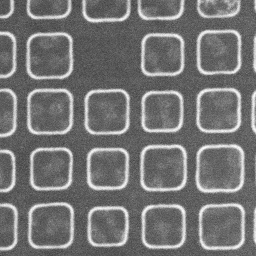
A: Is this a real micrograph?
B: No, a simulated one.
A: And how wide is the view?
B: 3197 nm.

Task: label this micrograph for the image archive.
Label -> a regular array of raised bodies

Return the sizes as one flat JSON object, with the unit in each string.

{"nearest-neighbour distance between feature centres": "0.699 µm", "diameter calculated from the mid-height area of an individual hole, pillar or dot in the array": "0.573 microns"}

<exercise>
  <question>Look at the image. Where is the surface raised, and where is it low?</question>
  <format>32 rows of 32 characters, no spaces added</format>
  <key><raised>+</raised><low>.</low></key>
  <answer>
++..+++++.++++++.++++++..+++++..
+...+++++..+++++.++++++..+++++..
...........++++.................
................................
+...++++...........+++...+++++..
++.++++++.........+++++..+++++..
++..+++++.........+++++..+++++..
++..+++++.........+++++..+++++..
++..+++++.........+++++..+++++..
+...++++........................
................................
+...++++....++++.........+++++..
++..+++++..+++++..+++++..+++++..
++..+++++..+++++..+++++..+++++..
++..+++++..+++++..+++++..+++++..
++..+++++..+++++..+++++..+++++..
+...++++....+++.................
................................
..................+++++...++++..
++..+++++..+++++..+++++..+++++..
++..+++++..+++++..+++++..+++++..
++..+++++..+++++..+++++..+++++..
++..+++++..+++++..+++++..+++++..
+....+++....+++...++++...+++++..
................................
......++........................
++..+++++..+++++..+++++..+++++..
++..+++++..+++++..+++++..+++++..
++..+++++..+++++..+++++..+++++..
++..+++++..+++++..+++++..+++++..
++..+++++...+++...+++++..+++++..
................................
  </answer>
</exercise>